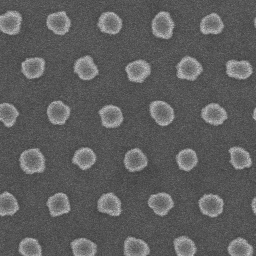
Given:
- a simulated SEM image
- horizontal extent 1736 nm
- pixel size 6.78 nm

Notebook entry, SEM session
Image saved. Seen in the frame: a regular array of raised bodies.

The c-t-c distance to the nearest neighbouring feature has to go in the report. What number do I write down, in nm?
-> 344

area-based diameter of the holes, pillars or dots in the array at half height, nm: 149